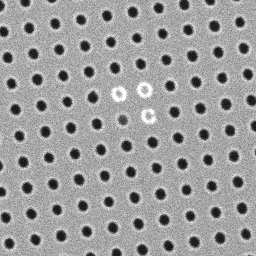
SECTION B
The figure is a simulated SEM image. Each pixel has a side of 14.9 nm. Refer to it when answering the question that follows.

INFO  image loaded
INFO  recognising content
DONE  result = a regular array of holes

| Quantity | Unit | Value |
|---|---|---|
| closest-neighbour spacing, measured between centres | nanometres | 388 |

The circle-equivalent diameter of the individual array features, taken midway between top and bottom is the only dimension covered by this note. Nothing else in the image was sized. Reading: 0.176 µm